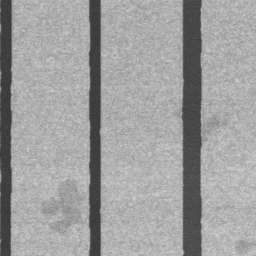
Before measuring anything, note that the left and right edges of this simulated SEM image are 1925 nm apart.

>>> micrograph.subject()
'lines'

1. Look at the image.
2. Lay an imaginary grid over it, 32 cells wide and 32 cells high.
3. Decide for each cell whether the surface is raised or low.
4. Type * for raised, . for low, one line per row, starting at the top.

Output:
..*********..**********..*******
..*********..**********..*******
..*********..**********..*******
..*********..**********..*******
..*********..**********..*******
..*********..**********..*******
..*********..**********..*******
..*********..**********..*******
.**********..**********..*******
..*********..**********..*******
.**********..**********..*******
.**********..**********..*******
.**********..**********..*******
.**********..**********..*******
..*********..**********..*******
.**********..**********..*******
.**********..**********..*******
.**********..**********..*******
.**********..**********..*******
.**********..**********..*******
.**********..**********..*******
..*********..**********..*******
..*********..**********..*******
..*********..**********..*******
.**********..**********..*******
.**********..**********..*******
.**********..**********..*******
.**********..**********..*******
.**********..**********..*******
.**********..**********..*******
.**********..**********..*******
.**********..**********..*******